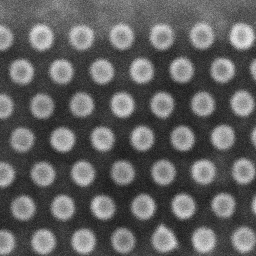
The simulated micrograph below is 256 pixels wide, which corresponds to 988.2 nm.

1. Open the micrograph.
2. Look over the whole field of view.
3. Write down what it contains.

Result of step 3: a regular array of raised bodies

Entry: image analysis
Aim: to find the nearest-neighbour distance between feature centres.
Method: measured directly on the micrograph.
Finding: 39.2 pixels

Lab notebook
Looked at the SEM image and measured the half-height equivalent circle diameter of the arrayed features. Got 85.6 nanometers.